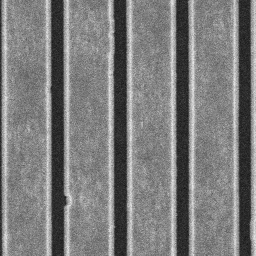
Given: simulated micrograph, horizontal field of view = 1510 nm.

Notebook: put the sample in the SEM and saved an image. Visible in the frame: one or a few lines or trenches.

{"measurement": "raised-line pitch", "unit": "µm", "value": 0.368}